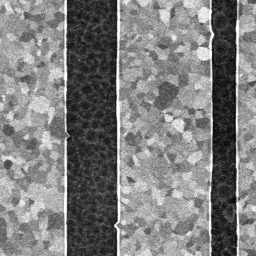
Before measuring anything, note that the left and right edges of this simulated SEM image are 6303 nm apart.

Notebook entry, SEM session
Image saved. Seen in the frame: one or a few lines or trenches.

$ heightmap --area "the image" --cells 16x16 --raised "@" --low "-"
@@@@---@@@@@@--@
@@@@---@@@@@@--@
@@@@---@@@@@@--@
@@@@---@@@@@@--@
@@@@---@@@@@@--@
@@@@---@@@@@@--@
@@@@---@@@@@@--@
@@@@---@@@@@@--@
@@@@---@@@@@@--@
@@@@---@@@@@@--@
@@@@---@@@@@@--@
@@@@---@@@@@@--@
@@@@---@@@@@@--@
@@@@---@@@@@@--@
@@@@---@@@@@@--@
@@@@---@@@@@@--@